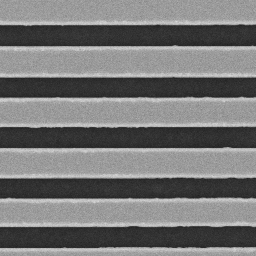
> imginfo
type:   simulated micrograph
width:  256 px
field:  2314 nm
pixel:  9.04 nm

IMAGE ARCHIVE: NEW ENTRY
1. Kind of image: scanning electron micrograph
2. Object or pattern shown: lines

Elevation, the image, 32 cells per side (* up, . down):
********************************
********************************
********************************
................................
................................
................................
********************************
********************************
********************************
********************************
................................
................................
********************************
********************************
********************************
********************************
................................
................................
............................*...
********************************
********************************
********************************
................................
................................
................................
********************************
********************************
********************************
................................
................................
................................
********************************